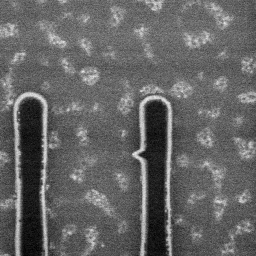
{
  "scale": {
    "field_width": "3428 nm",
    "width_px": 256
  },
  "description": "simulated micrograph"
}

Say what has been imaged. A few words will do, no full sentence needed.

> one or a few lines or trenches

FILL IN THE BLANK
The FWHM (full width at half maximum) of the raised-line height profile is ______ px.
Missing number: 26.3